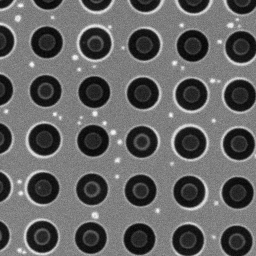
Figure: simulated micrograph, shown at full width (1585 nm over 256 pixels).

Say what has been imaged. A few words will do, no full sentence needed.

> an array of small figures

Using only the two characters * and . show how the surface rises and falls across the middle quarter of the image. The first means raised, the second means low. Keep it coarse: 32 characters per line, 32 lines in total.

********************************
********************************
********************************
******....********....*********.
****.......******......******...
****..***..*****...*...*****....
***...***...****..***...****..**
***...***...***...***...***...**
****..***..*****..***...****..**
****.......*****.......*****...*
*****.....*******......******...
*******************.**********..
********************************
********************************
********************************
******...**********..*********..
****......*******.....*******...
****..**...*****.......*****....
***..****..****...***...***...**
***..****..****...***...***...**
***...***..*****..***...***...**
****.......*****.......*****...*
*****.....*******.....******....
*******************.**********..
********************************
********************************
********************************
******..***********.************
****......*******.....*******...
***........*****.......*****....
***..***...****...**...****...**
***..****..****..****..****...**